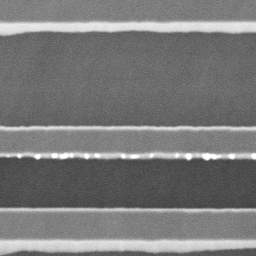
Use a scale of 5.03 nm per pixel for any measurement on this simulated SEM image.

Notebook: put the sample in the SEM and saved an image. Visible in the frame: lines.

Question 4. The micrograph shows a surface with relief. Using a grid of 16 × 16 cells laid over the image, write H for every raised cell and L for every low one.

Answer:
HHHHHHHHHHHHHHHH
HHHHHHHHHHHHHHHH
LLLLLLLLLLLLLLLL
LLLLLLLLLLLLLLLL
LLLLLLLLLLLLLLLL
LLLLLLLLLLLLLLLL
LLLLLLLLLLLLLLLL
LLLLLLLLLLLLLLLL
HHHHHHHHHHHHHHHH
HHHHHHHHHHHHHHHH
LLLLLLLLLLLLLLLL
LLLLLLLLLLLLLLLL
LLLLLLLLLLLLLLLL
HHHHHHHHHHHHHHHH
HHHHHHHHHHHHHHHH
LLLLLLLLLLLLLLLL